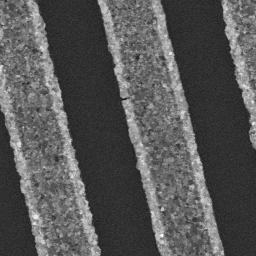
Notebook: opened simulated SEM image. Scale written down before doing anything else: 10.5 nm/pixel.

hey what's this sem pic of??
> one or a few lines or trenches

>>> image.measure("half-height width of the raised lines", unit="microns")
0.536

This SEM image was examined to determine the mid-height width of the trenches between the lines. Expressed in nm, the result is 723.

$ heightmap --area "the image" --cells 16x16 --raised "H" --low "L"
HHLLLLLHHHLLLLHH
HHLLLLLHHHLLLLHH
HHHLLLLHHHLLLLLH
HHHLLLLHHHHLLLLH
HHHLLLLHHHHLLLLH
HHHLLLLLHHHLLLLH
HHHHLLLLHHHLLLLL
LHHHLLLLHHHHLLLL
LHHHLLLLLHHHLLLL
LHHHLLLLLHHHLLLL
LHHHHLLLLHHHLLLL
LLHHHLLLLHHHHLLL
LLHHHLLLLLHHHLLL
LLHHHLLLLLHHHLLL
LLHHHHLLLLHHHLLL
LLLHHHLLLLHHHHLL